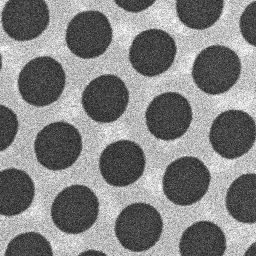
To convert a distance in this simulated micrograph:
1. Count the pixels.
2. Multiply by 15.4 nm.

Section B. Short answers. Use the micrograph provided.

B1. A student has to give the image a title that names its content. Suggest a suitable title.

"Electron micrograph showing a regular array of holes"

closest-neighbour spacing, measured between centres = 1020 nanometers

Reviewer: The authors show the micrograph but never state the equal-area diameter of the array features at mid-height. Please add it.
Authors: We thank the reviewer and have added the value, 0.752 microns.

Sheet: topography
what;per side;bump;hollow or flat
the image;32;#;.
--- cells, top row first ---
#.....#########....###......###.
......####...###.#####......##..
......###.....########.....###..
......##......##########..####..
#....###......###....#########..
########......##......#########.
#########....###......###....###
####...#########......##......##
###.....#########....###......##
##......####...###.#####......##
##......###.....########.....###
##......##......#####.###...####
###....###......###....#########
.#########......##......########
..#########....###......###....#
..####...#########......##......
..###.....#########....###......
..##......#####.####..####......
.###......###.....#########....#
#####.....###.....##########..##
#####....###......###.....######
...##########.....###.....######
....#########....###......###...
....####...#########......###...
....###.....#########....###....
....###.....####...###..####....
...###......###.....########....
#######.....###.....#########...
#######....###......###.....####
##...#########......###.....####
#.....#########....###......####
#......###...#########......###.